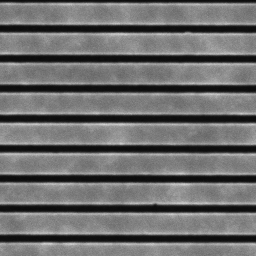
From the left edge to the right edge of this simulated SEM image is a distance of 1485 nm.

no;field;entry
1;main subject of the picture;parallel lines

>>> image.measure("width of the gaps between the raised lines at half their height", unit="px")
7.26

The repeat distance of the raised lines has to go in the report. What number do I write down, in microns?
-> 0.174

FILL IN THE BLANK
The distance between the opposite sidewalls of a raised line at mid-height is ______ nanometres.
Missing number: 131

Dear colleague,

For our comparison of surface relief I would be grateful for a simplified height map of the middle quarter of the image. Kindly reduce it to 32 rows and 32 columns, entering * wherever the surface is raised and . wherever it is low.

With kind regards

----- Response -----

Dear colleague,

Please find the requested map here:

********************************
********************************
********************************
********************************
********************************
................................
................................
********************************
********************************
********************************
********************************
********************************
.....**.........*..*************
................................
................................
********************************
********************************
********************************
********************************
********************************
................................
................................
********************************
********************************
********************************
********************************
********************************
********************************
................................
................................
********************************
********************************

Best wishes